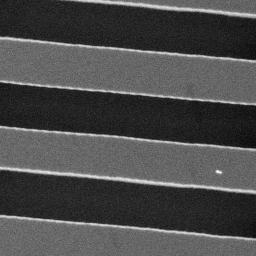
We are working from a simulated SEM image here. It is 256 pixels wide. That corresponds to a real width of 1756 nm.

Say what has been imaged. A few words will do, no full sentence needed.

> lines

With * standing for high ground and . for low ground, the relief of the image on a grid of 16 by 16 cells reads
...........*****
................
**..............
************....
****************
....************
...............*
................
*******.........
****************
****************
..........******
................
................
***********.....
****************